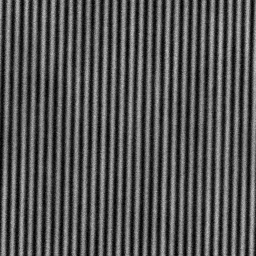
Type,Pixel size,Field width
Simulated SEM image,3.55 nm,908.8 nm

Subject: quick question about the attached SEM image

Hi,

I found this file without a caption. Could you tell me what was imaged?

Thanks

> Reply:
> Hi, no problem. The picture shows parallel lines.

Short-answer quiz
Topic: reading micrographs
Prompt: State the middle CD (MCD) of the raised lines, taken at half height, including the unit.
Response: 0.0129 microns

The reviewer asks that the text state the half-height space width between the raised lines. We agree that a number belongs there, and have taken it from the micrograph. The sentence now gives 19.1 nanometers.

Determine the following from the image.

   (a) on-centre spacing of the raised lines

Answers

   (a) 31.4 nm